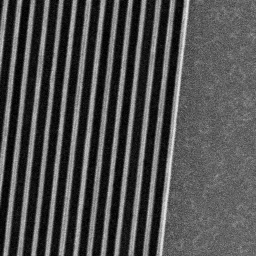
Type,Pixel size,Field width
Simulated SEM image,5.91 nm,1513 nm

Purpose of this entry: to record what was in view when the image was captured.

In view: parallel lines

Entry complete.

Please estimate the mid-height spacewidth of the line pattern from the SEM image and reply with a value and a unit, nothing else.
57.2 nanometres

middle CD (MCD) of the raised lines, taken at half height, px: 4.84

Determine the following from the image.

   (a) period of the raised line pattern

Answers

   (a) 81.7 nm